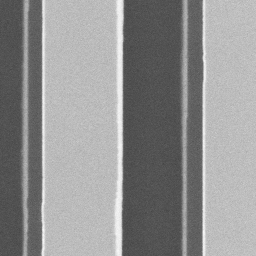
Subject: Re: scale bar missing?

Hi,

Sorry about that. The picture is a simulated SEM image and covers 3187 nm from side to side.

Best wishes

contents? lines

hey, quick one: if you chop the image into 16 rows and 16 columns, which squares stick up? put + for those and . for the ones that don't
...+++++.....+++
...+++++.....+++
...+++++.....+++
...+++++.....+++
...+++++.....+++
...+++++.....+++
...+++++.....+++
...+++++.....+++
...+++++.....+++
...+++++.....+++
...+++++.....+++
...+++++.....+++
...+++++.....+++
...+++++.....+++
...+++++.....+++
...+++++.....+++